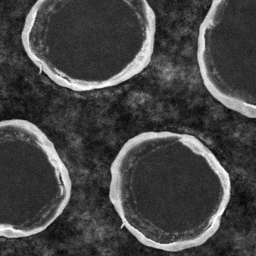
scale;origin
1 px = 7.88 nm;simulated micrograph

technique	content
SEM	raised bodies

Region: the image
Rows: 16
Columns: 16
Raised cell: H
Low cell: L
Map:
LLHHHHHHHLLLLHHH
LLHHHHHHHLLLLHHH
LLHHHHHHHLLLLHHH
LLHHHHHHHLLLLHHH
LLLHHHHHLLLLLHHH
LLLLLHLLLLLLLHHH
LLLLLLLLLLLLLLLH
LLLLLLLLLLLLLLLL
HHLLLLLLLLHLLLLL
HHHLLLLLHHHHHLLL
HHHHLLLHHHHHHHLL
HHHHLLLHHHHHHHLL
HHHHLLLHHHHHHHLL
HHHLLLLLHHHHHHLL
LHLLLLLLHHHHHLLL
LLLLLLLLLLLLLLLL